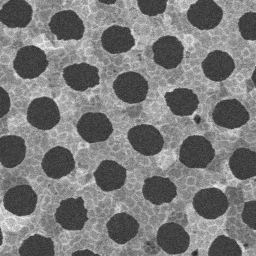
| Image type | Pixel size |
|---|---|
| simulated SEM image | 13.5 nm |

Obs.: a regular array of holes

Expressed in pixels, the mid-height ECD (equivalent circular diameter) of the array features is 33.6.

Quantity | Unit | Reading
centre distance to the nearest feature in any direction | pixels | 50.7